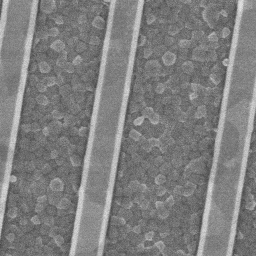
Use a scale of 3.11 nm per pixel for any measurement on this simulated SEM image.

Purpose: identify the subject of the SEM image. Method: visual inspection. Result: one or a few lines or trenches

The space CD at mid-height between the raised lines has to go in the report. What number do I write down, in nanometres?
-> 305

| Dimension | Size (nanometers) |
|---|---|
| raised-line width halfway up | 88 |